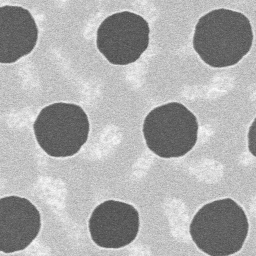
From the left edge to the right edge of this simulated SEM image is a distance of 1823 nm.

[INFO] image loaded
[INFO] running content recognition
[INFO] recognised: holes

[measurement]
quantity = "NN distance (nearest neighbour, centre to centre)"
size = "741 nanometers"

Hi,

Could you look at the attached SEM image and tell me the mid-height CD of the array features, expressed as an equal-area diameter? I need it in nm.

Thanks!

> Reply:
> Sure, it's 397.